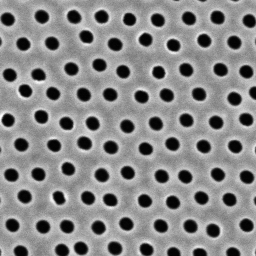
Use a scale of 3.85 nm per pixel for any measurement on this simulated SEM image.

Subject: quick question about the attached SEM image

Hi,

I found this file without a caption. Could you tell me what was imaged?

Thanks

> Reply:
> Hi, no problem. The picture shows a regular array of holes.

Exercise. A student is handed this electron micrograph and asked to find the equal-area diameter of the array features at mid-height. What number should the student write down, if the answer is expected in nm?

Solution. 50.1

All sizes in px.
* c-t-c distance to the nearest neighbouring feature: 26.1